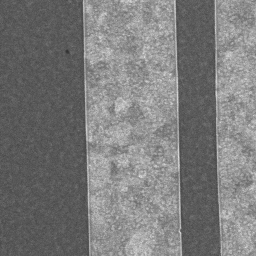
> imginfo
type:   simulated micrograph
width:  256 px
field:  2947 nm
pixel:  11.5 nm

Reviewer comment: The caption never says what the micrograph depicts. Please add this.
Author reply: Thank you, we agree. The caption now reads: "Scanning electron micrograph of one or a few lines or trenches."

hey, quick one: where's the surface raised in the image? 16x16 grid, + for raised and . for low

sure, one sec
.....++++++..+++
.....++++++..+++
.....++++++...++
.....++++++..+++
.....++++++...++
.....++++++...++
.....++++++...++
.....++++++...++
.....++++++...++
.....++++++...++
.....++++++...++
......+++++...++
......+++++...++
......+++++...++
......+++++...++
......+++++...++